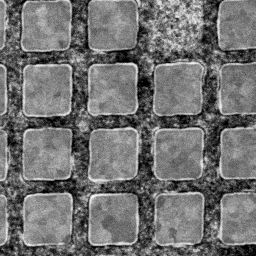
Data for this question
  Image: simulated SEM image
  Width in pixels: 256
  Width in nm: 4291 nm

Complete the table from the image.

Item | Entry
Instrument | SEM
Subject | a regular array of raised bodies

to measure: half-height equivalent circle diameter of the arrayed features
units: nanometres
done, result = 923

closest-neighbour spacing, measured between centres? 1090 nm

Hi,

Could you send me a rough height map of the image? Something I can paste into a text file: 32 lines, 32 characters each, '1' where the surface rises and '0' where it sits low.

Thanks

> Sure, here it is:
10011111100111111000000000001111
10011111100111111000000000011111
10011111100111111000000000011111
10011111100111111000000000011111
10011111100111111000000000011111
10011111100111111000000000011111
00000000000000000000000000000000
00000000000000000000000000000000
10011111100111111000111110001111
10011111100111111001111110001111
10011111100111111001111110001111
10011111100111111001111110001111
10011111100111111001111110011111
10011111100111111001111110011111
00010000000000000000000000000000
00000000000000000000000000000000
10011111100011111000111110001111
10011111100111111001111110001111
10011111100111111001111110001111
10011111100111111001111110001111
10011111100111111001111110001111
10011111100111111001111110001111
00000000000010000000011000000000
00000000000000000000000000000000
00001111100011111000111110001111
10011111100111111000111110001111
10011111100111111001111110001111
10011111100111111001111110001111
10011111100111111001111110001111
10011111100111111001111110001111
00011011000011110000110100001100
00000000000000000000000000000000